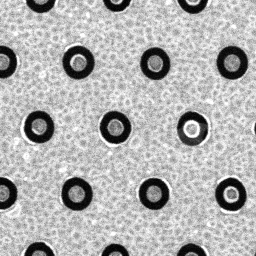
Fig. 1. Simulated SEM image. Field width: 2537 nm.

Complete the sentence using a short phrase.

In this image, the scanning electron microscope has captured a regular array of ring-shaped grooves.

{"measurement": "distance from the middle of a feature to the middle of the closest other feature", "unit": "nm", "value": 750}